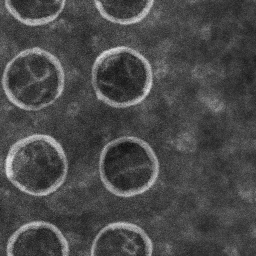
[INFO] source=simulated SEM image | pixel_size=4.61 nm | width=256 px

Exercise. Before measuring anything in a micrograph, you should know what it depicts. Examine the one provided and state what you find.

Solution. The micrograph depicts raised bodies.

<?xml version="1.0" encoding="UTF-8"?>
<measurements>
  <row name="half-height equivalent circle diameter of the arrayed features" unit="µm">0.274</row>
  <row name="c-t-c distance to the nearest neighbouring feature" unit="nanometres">402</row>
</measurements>